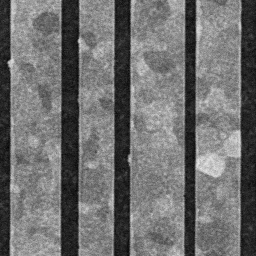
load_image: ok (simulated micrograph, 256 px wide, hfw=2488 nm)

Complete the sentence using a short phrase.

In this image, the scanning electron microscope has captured one or a few lines or trenches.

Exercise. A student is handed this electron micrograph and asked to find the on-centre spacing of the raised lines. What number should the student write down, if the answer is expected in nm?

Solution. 591